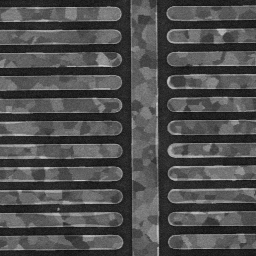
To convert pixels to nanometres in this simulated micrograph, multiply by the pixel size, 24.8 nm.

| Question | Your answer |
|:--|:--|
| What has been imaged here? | groups of lines, slits or small figures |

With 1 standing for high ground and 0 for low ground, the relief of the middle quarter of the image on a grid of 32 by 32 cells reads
11111110001110000111111000000000
00000000000000000111111000000000
00000000000000000111111000000000
11111111111111000111111000111111
11111111111111000111111000111111
11111111111111000111111000111111
00000000000000000111111000000000
00000000000000000111111000000000
00000000000000000111111000000000
11111111111111000111111000111111
11111111111111000111111000111111
11111111111111000111111000111111
00000000000000000111111000000000
00000000000000000111111000000000
11111111111110000111111000011111
11111111111111000111111000111111
11111111111111000111111000111111
11111111111111000111111000000111
00000000000000000111111000000000
00000000000000000111111000000000
11111111111111000111111000011111
11111111111111000111111000111111
11111111111111000111111000011111
00000000000000000111111000000000
00000000000000000111111000000000
00000000000000000111111000000000
11111111111111000111111000111111
11111111111111000111111100111111
11111111111111000111111100011111
00000000000000000111111100000000
00000000000000000111111100000000
00000000000000000111111100000000